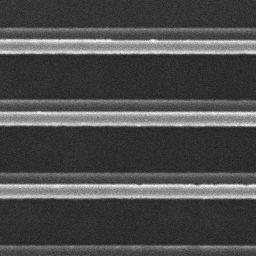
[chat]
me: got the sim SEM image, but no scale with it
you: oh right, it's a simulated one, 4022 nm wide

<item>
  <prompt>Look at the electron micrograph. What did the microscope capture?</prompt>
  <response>lines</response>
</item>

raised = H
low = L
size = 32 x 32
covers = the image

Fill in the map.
LLLLLLLLLLLLLLLLLLLLLLLLLLLLLLLL
LLLLLLLLLLLLLLLLLLLLLLLLLLLLLLLL
LLLLLLLLLLLLLLLLLLLLLLLLLLLLLLLL
LLLLLLLLLLLLLLLLLLLLLLLLLLLLLLLL
HHHHHHHHHHHHHHHHHHHHHHHHHHHHHHHH
HHHHHHHHHHHHHHHHHHHHHHHHHHHHHHHH
HHHHHHHHHHHHHHHHHHHHHHHHHHHHHHHH
LLLLLLLLLLLLLLLLLLLLLLLLLLLLLLLL
LLLLLLLLLLLLLLLLLLLLLLLLLLLLLLLL
LLLLLLLLLLLLLLLLLLLLLLLLLLLLLLLL
LLLLLLLLLLLLLLLLLLLLLLLLLLLLLLLL
LLLLLLLLLLLLLLLLLLLLLLLLLLLLLLLL
LLLLLLLLLLLLLLLLLLLLLLLLLLLLLLLL
HHHHHHHHHHHHHHHHHHHHHHHHHHHHHHHH
HHHHHHHHHHHHHHHHHHHHHHHHHHHHHHHH
HHHHHHHHHHHHHHHHHHHHHHHHHHHHHHHH
LLLLLLLLLLLLLLLLLLLLLLLLLLLLLLLL
LLLLLLLLLLLLLLLLLLLLLLLLLLLLLLLL
LLLLLLLLLLLLLLLLLLLLLLLLLLLLLLLL
LLLLLLLLLLLLLLLLLLLLLLLLLLLLLLLL
LLLLLLLLLLLLLLLLLLLLLLLLLLLLLLLL
LLLLLLLLLLLLLLLLLLLLLLLLLLLLLLLL
HHHHHHHHHHHHHHHHHHHHHHHHHHHHHHHH
HHHHHHHHHHHHHHHHHHHHHHHHHHHHHHHH
HHHHHHHHHHHHHHHHHHHHHHHHHHHHHHHH
LLLLLLLLLLLLLLLLLLLLLLLLLLLLLLLL
LLLLLLLLLLLLLLLLLLLLLLLLLLLLLLLL
LLLLLLLLLLLLLLLLLLLLLLLLLLLLLLLL
LLLLLLLLLLLLLLLLLLLLLLLLLLLLLLLL
LLLLLLLLLLLLLLLLLLLLLLLLLLLLLLLL
LLLLLLLLLLLLLLLLLLLLLLLLLLLLLLLL
HHHHHHHHHHHHHHHHHHHHHHHHHHHHHHHH